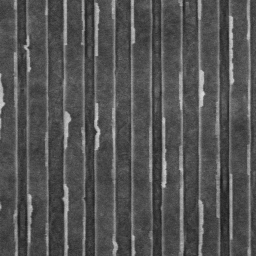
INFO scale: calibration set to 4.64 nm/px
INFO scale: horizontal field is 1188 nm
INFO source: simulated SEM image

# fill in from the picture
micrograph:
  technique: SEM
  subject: parallel lines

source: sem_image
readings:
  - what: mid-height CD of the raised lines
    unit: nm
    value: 97.5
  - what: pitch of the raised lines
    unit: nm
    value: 156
